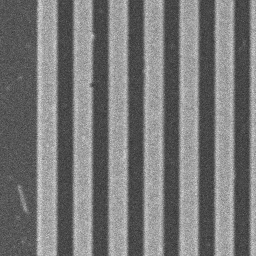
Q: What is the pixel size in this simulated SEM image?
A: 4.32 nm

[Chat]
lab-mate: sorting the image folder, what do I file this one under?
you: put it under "parallel lines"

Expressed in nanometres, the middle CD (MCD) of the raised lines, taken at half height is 79.3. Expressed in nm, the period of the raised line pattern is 153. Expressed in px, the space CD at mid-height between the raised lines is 17.4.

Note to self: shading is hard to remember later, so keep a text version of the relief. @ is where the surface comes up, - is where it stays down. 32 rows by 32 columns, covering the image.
-----@@--@@---@@--@@---@@--@@--@
-----@@--@@---@@--@@---@@--@@--@
-----@@--@@---@@--@@---@@--@@--@
-----@@--@@---@@--@@---@@--@@--@
-----@@--@@@--@@--@@---@@--@@--@
-----@@--@@---@@--@@---@@--@@--@
-----@@--@@---@@--@@---@@--@@--@
-----@@--@@---@@--@@---@@--@@--@
-----@@--@@---@@--@@---@@--@@--@
-----@@--@@---@@--@@---@@--@@--@
-----@@--@@---@@--@@---@@--@@--@
-----@@--@@---@@--@@---@@--@@--@
-----@@--@@---@@--@@---@@--@@--@
-----@@--@@---@@--@@---@@--@@--@
-----@@--@@---@@--@@---@@--@@--@
-----@@--@@---@@--@@---@@--@@--@
-----@@--@@---@@--@@---@@--@@--@
-----@@--@@---@@--@@---@@--@@--@
-----@@--@@---@@--@@---@@--@@--@
-----@@--@@---@@--@@---@@--@@--@
-----@@--@@---@@--@@---@@--@@--@
-----@@--@@---@@--@@---@@--@@--@
-----@@--@@---@@--@@---@@--@@--@
-----@@--@@---@@--@@---@@--@@--@
-----@@--@@---@@--@@---@@--@@--@
-----@@--@@---@@--@@---@@--@@--@
-----@@--@@---@@--@@---@@--@@--@
-----@@--@@---@@--@@---@@--@@--@
-----@@--@@---@@--@@---@@--@@--@
-----@@--@@---@@--@@---@@--@@--@
-----@@--@@---@@--@@---@@--@@--@
-----@@--@@---@@--@@---@@--@@--@